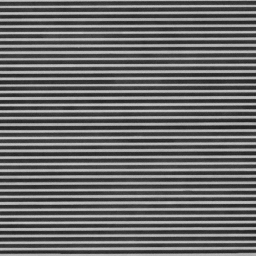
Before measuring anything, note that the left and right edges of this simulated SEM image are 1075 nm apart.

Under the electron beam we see parallel lines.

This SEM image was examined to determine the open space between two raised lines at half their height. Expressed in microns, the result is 0.0163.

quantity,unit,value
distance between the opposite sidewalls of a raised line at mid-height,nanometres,12.1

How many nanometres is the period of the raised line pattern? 27.5